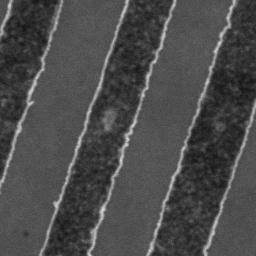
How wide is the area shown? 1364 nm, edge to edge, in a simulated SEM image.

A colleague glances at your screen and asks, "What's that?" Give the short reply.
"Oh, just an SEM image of one or a few lines or trenches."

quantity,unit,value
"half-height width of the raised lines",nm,243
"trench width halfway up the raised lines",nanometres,300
